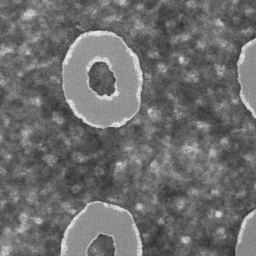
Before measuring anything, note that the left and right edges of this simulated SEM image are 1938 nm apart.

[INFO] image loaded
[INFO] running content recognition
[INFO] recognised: ring-shaped raised bodies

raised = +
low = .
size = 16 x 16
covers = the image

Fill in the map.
................
................
.....+++........
....++++.......+
....++.++......+
....++.++......+
....+++++......+
.....+++........
................
................
................
................
................
.....+++........
....+++++......+
....++.++......+